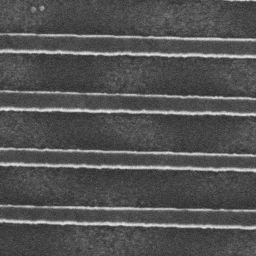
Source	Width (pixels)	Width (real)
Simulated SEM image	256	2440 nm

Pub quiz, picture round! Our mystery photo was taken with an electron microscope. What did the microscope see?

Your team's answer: lines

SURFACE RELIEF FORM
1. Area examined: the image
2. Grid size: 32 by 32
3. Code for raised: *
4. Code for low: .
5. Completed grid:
................................
................................
................................
................................
***************.................
********************************
********************************
................................
................................
................................
................................
**..............................
********************************
********************************
................................
................................
................................
................................
................................
********************************
********************************
................................
................................
................................
................................
................................
********************************
********************************
...............................*
................................
................................
................................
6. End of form